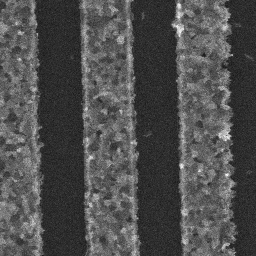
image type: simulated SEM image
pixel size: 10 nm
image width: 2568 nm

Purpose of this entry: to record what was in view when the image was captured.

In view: one or a few lines or trenches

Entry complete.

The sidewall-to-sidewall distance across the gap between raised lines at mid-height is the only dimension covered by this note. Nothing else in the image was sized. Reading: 519 nanometers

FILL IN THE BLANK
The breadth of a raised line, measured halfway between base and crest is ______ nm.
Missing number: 445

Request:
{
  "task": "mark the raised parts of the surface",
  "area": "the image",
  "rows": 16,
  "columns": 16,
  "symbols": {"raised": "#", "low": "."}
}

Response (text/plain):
##...###...###..
##...###...###..
##...###...###..
##...###...###..
##...###...###..
##...###...###..
##...###...###..
##...###...###..
##...###...###..
##...###...###..
##....##...###..
##....##...###..
##....##...###..
##....##....##..
##....##....###.
##....##....##..